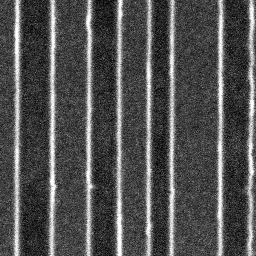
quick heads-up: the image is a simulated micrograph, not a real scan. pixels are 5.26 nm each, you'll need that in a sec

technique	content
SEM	one or a few lines or trenches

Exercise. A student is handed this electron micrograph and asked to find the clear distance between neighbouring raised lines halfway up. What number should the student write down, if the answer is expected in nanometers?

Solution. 154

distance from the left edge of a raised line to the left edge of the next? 330 nanometres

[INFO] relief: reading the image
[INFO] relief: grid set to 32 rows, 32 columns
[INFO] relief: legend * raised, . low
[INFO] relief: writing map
**.....****....****...******...*
**.....****....****...******...*
**.....****....****...******...*
**.....****....****...******...*
**.....****....****..*******...*
**.....****....****..*******...*
**.....****....****...******...*
**.....****....****..*******...*
**.....****....****..*******...*
**....*****....****..*******...*
**.....****....****...******...*
**.....****....****...******....
**.....****....****...******...*
**.....****....****..*******...*
**.....****....****..*******...*
**.....****....****..*******...*
**.....****....****..*******...*
**....*****....****..*******...*
**....*****....****..*******...*
**....*****....****..*******...*
**.....****....****..*******...*
**.....****....****..*******...*
**....*****....****..*******...*
**.....****....****..*******...*
**.....****....****..*******...*
**.....****....****..*******...*
**.....****....****..*******...*
**.....****....****..*******...*
**.....****....****..*******...*
**.....****....****..*******...*
**.....****....****..*******...*
**.....****....****..*******...*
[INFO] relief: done